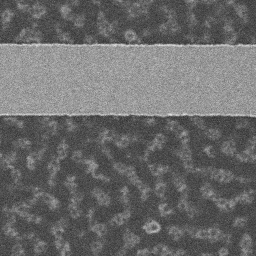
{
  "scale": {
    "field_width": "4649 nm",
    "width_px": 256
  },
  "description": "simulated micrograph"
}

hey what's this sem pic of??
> one or a few lines or trenches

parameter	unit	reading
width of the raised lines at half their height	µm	1.27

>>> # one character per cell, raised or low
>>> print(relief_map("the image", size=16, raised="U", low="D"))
DDDDDDDDDDDDDDDD
DDDDDDDDDDDDDDDD
DDDDDDDDDDDDDDDD
UUUUUUUUUUUUUUUU
UUUUUUUUUUUUUUUU
UUUUUUUUUUUUUUUU
UUUUUUUUUUUUUUUU
DDDDDDDDDDDDDDDD
DDDDDDDDDDDDDDDD
DDDDDDDDDDDDDDDD
DDDDDDDDDDDDDDDD
DDDDDDDDDDDDDDDD
DDDDDDDDDDDDDDDD
DDDDDDDDDDDDDDDD
DDDDDDDDDDDDDDDD
DDDDDDDDDDDDDDDD